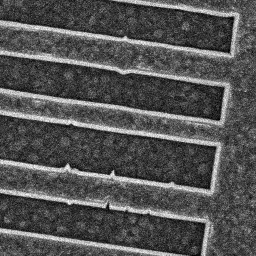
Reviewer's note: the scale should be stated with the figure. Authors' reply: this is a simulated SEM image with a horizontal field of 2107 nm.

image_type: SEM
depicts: one or a few lines or trenches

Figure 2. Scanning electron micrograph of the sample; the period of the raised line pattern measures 564 nanometers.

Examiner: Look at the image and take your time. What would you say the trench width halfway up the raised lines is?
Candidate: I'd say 310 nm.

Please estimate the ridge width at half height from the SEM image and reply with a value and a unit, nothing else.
247 nm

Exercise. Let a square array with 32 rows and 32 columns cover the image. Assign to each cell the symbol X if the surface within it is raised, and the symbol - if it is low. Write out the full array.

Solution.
-------------------XXXXXXXXXXXXX
--------------------------XXXXXX
-----------------------------XXX
XXXXXX-----------------------XXX
XXXXXXXXXXXX-----------------XXX
XXXXXXXXXXXXXXXXXXXX---------XXX
XXXXXXXXXXXXXXXXXXXXXXXXXX---XXX
-------XXXXXXXXXXXXXXXXXXXXXXXXX
-------------XXXXXXXXXXXXXXXXXXX
--------------------XXXXXXXXXXXX
---------------------------XXXXX
X---------------------------XXXX
XXXXXXX---------------------XXXX
XXXXXXXXXXXXXXXX------------XXXX
--XXXXXXXXXXXXXXXXXXXX------XXXX
----------XXXXXXXXXXXXXXXXXXXXXX
----------------XXXXXXXXXXXXXXXX
-----------------------XXXXXXXXX
---------------------------XXXXX
---------------------------XXXXX
XXX------------------------XXXXX
XXXXXXXXXX-----------------XXXXX
XXXXXXXXXXXXXXXX-----------XXXXX
XXXXXXXXXXXXXXXXXXXXXXX---XXXXXX
----XXXXXXXXXXXXXXXXXXXXXXXXXXXX
-----------XXXXXXXXXXXXXXXXXXXXX
------------------XXXXXXXXXXXXXX
------------------------XXXXXXXX
--------------------------XXXXXX
XXXXXX--------------------XXXXXX
XXXXXXXXXXXX--------------XXXXXX
XXXXXXXXXXXXXXXXXX-------XXXXXXX